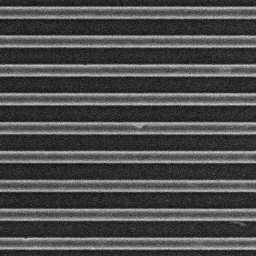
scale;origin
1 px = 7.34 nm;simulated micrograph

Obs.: parallel lines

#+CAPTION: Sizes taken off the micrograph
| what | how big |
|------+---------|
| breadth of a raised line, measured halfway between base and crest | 0.0799 µm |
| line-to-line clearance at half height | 133 nm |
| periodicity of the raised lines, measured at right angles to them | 212 nanometers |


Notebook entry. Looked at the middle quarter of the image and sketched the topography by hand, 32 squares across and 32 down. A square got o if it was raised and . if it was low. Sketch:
oooooooooooooooooooooooooooooooo
oooooooooooooooooooooooooooooooo
oooooooooooooooooooooooooooooooo
................................
................................
................................
................................
................................
oooooooooooooooooooooooooooooooo
oooooooooooooooooooooooooooooooo
................................
................................
................................
................................
................................
oooooooooooooooooooooooooooooooo
oooooooooooooooooooooooooooooooo
................................
................................
................................
................................
................................
oooooooooooooooooooooooooooooooo
oooooooooooooooooooooooooooooooo
oooooo..ooooooooo.ooooo.oooooooo
................................
................................
................................
................................
oooooooooooooooooooooooooooooooo
oooooooooooooooooooooooooooooooo
oooooooooooooooooooooooooooooooo